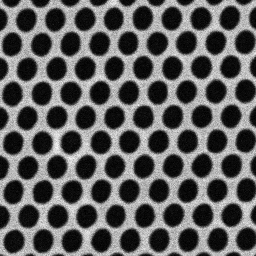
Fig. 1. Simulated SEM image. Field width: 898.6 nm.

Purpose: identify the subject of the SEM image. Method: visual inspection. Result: a regular array of holes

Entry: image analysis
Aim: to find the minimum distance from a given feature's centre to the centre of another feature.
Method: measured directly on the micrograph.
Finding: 99.4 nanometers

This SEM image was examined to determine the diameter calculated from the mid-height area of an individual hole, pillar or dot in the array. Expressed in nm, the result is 77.